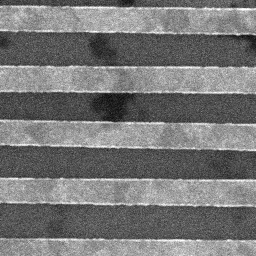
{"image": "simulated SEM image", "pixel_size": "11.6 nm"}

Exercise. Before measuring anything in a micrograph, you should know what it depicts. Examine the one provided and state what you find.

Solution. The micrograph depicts lines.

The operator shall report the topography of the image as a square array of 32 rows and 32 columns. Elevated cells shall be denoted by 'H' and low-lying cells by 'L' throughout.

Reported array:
LLLLLLLLLLLLLLLLLLLLLLLLLLLLLLLL
HHHHHHHHHHHHHHHHHHHHHHHHHHHHHHHH
HHHHHHHHHHHHHHHHHHHHHHHHHHHHHHHH
HHHHHHHHHHHHHHHHHHHHHHHHHHHHHHHH
LLLLLLLLLLLLLLLLLLLLLLLLLLLLLLLL
LLLLLLLLLLLLLLLLLLLLLLLLLLLLLLLL
LLLLLLLLLLLLLLLLLLLLLLLLLLLLLLLL
LLLLLLLLLLLLLLLLLLLLLLLLLLLLLLLL
HHHHHHHHHHHHHHHHHHHHHHHHHLHLLLLL
HHHHHHHHHHHHHHHHHHHHHHHHHHHHHHHH
HHHHHHHHHHHHHHHHHHHHHHHHHHHHHHHH
LLLLLLLLLLLLLLLLLLLLLLLHHHHHHHHH
LLLLLLLLLLLLLLLLLLLLLLLLLLLLLLLL
LLLLLLLLLLLLLLLLLLLLLLLLLLLLLLLL
LLLLLLLLLLLLLLLLLLLLLLLLLLLLLLLL
HHHHHHHHHHHHHHHHHHHHHHHHHHLLLLLL
HHHHHHHHHHHHHHHHHHHHHHHHHHHHHHHH
HHHHHHHHHHHHHHHHHHHHHHHHHHHHHHHH
LLLLLLLLLLLLLLLLLLLHLHHHHHHHHHHH
LLLLLLLLLLLLLLLLLLLLLLLLLLLLLLLL
LLLLLLLLLLLLLLLLLLLLLLLLLLLLLLLL
LLLLLLLLLLLLLLLLLLLLLLLLLLLLLLLL
HHHHHHHHHHHHHHHHHLHHLLLLLLLLLLLL
HHHHHHHHHHHHHHHHHHHHHHHHHHHHHHHH
HHHHHHHHHHHHHHHHHHHHHHHHHHHHHHHH
LLLLLLLLLLLHHHHHHHHHHHHHHHHHHHHH
LLLLLLLLLLLLLLLLLLLLLLLLLLLLLLLL
LLLLLLLLLLLLLLLLLLLLLLLLLLLLLLLL
LLLLLLLLLLLLLLLLLLLLLLLLLLLLLLLL
LLLLLLLLLLLLLLLLLLLLLLLLLLLLLLLL
HHHHHHHHHHHHHHHHHHHHHHHHHHHHHHHH
HHHHHHHHHHHHHHHHHHHHHHHHHHHHHHHH